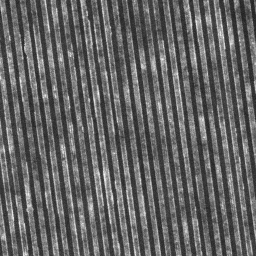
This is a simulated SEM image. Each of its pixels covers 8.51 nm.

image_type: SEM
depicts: parallel lines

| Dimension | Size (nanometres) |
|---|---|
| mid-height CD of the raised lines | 43.2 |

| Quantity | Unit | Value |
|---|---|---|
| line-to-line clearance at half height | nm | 43.2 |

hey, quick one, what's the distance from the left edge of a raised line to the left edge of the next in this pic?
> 85.9 nanometers